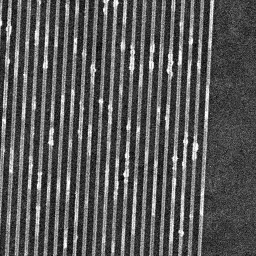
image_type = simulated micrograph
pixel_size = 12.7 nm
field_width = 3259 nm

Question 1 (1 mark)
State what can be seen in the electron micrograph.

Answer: parallel lines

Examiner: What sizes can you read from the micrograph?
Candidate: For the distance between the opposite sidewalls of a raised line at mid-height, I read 2.62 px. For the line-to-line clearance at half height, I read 89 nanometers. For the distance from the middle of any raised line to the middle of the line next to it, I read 0.122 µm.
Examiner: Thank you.